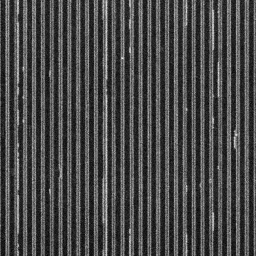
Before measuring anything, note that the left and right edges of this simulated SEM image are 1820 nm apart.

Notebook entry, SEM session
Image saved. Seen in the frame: parallel lines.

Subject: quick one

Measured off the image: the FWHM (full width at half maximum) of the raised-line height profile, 20.5 nm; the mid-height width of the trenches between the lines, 40.9 nanometres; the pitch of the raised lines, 63.1 nm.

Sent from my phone